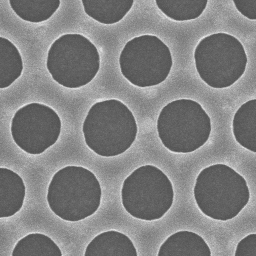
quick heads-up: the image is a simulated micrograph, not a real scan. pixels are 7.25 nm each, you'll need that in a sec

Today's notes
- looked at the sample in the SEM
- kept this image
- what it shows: a regular array of holes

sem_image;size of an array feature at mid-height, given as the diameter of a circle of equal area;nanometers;389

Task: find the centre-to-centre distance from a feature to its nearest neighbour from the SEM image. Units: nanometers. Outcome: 533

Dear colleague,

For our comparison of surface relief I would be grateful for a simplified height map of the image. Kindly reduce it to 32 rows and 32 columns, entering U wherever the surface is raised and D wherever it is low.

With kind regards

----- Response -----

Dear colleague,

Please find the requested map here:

UDDDDDDUUUDDDDDDDUUUDDDDDDUUUDDD
UUDDDDDUUUUDDDDDUUUUDDDDDUUUUUDD
UUUDDDUUUUUUDDDUUUUUUUDDUUUUUUUU
UUUUUUUUUUUUUUUUUUUUUUUUUUUUUUUU
UUUUUUUUDDUUUUUUUUDUUUUUUUDDDUUU
DDUUUUUDDDDDUUUUDDDDUUUUUDDDDDUU
DDUUUUDDDDDDUUUDDDDDDUUUDDDDDDDU
DDDUUUDDDDDDDUUDDDDDDUUUDDDDDDDU
DDDUUUDDDDDDUUUDDDDDDUUUUDDDDDDU
DDUUUUDDDDDDUUUUDDDDDUUUUDDDDDUU
DUUUUUUUDDDUUUUUUDDDUUUUUUDDDUUU
UUUUUUUUUUUUUUUUUUUUUUUUUUUUUUUU
UUUUUUUUUUUUUDDUUUUUUUDDUUUUUUUD
UUUDDDUUUUUDDDDDUUUUDDDDDUUUUUDD
UUDDDDDUUUUDDDDDDUUUDDDDDDUUUDDD
UDDDDDDDUUDDDDDDDUUUDDDDDDUUUDDD
UDDDDDDUUUDDDDDDDUUUDDDDDDUUUDDD
UUDDDDDUUUUDDDDDDUUUDDDDDDUUUUDD
UUUDDDUUUUUDDDDDUUUUUDDDDUUUUUUD
UUUUUUUUUUUUUDUUUUUUUUUUUUUUUUUU
UUUUUUUUUUUUUUUUUUUUUUUUUUUUUUUU
DDUUUUUDDDDUUUUUUDDDUUUUUDDDDDUU
DDDUUUDDDDDDUUUUDDDDDUUUUDDDDDDU
DDDUUUDDDDDDDUUDDDDDDDUUDDDDDDDU
DDDUUUDDDDDDDUUDDDDDDDUUDDDDDDDU
DDDUUUDDDDDDUUUDDDDDDUUUUDDDDDDU
DDUUUUUDDDDDUUUUDDDDDUUUUDDDDDUU
UUUUUUUUDDUUUUUUUUUUUUUUUUUDDUUU
UUUUUUUUUUUUUUUUUUUUUUUUUUUUUUUU
UUUDDDUUUUUUDDDDUUUUUDDDDUUUUUUD
UUDDDDDUUUUDDDDDDUUUDDDDDDUUUUDD
UUDDDDDDUUUDDDDDDUUUDDDDDDUUUDDD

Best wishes